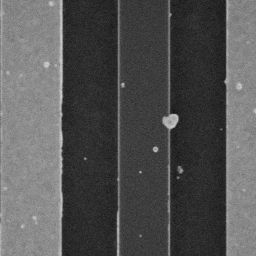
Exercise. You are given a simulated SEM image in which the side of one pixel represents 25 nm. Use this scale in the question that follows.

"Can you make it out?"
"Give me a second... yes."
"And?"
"lines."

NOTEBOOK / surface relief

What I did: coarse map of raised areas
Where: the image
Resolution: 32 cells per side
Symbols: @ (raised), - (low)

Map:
@@@@@@@@-------@@@@@@-------@@@@
@@@@@@@@-------@@@@@@-------@@@@
@@@@@@@@-------@@@@@@-------@@@@
@@@@@@@@-------@@@@@@-------@@@@
@@@@@@@@-------@@@@@@-------@@@@
@@@@@@@@-------@@@@@@-------@@@@
@@@@@@@@-------@@@@@@-------@@@@
@@@@@@@@-------@@@@@@-------@@@@
@@@@@@@@-------@@@@@@-------@@@@
@@@@@@@@-------@@@@@@-------@@@@
@@@@@@@@-------@@@@@@-------@@@@
@@@@@@@@-------@@@@@@-------@@@@
@@@@@@@@-------@@@@@@-------@@@@
@@@@@@@@-------@@@@@@-------@@@@
@@@@@@@@-------@@@@@@@------@@@@
@@@@@@@@-------@@@@@@@------@@@@
@@@@@@@@-------@@@@@@-------@@@@
@@@@@@@@-------@@@@@@-------@@@@
@@@@@@@@-------@@@@@@-------@@@@
@@@@@@@@-------@@@@@@-------@@@@
@@@@@@@@-------@@@@@@-------@@@@
@@@@@@@@-------@@@@@@-------@@@@
@@@@@@@@-------@@@@@@-------@@@@
@@@@@@@@-------@@@@@@-------@@@@
@@@@@@@@-------@@@@@@-------@@@@
@@@@@@@@-------@@@@@@-------@@@@
@@@@@@@@-------@@@@@@-------@@@@
@@@@@@@@-------@@@@@@-------@@@@
@@@@@@@@-------@@@@@@-------@@@@
@@@@@@@@-------@@@@@@-------@@@@
@@@@@@@@-------@@@@@@-------@@@@
@@@@@@@@-------@@@@@@-------@@@@